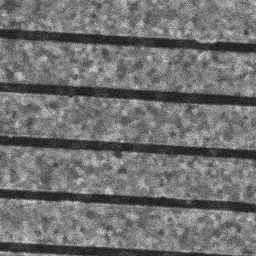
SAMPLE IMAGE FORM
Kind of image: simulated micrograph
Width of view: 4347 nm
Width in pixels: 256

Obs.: parallel lines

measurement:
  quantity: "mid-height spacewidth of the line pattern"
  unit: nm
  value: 180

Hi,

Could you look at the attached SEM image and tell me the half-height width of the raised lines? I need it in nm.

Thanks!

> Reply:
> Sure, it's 716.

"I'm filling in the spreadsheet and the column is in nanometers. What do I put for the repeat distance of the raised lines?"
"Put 900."